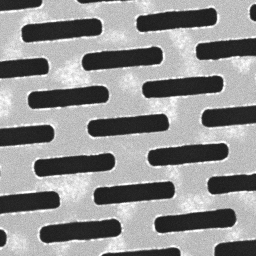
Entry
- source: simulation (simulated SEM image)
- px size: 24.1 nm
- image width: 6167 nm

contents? a regular array of holes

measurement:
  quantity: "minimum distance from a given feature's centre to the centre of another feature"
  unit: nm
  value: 1600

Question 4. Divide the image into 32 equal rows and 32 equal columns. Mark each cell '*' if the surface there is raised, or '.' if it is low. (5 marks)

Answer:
.....*****.*********************
********************.......****.
********....*****..........*****
***..........****.......********
***.........********************
*************************.......
************........****........
*.....****..........*****..*****
......****.....*****************
....**********************.*****
******************..........****
****..........****.........*****
***...........******************
****...********************.....
*****************....****.......
***********..........****......*
.......****.........************
.......*************************
********************.........***
*********.....****..........****
****..........*****....*********
****........********************
**************************......
************..........****......
.......*****..........**********
.......*****...*****************
..**********************.....***
*************..****...........**
*****..........****.........****
.****..........*****************
.**************************.....
***************........****.....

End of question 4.